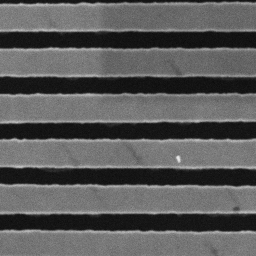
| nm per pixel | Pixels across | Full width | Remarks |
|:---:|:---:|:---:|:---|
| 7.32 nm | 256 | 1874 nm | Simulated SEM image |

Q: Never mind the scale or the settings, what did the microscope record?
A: lines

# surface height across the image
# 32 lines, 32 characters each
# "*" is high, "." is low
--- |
*.******************************
********************************
********************************
********************************
................................
................................
********************************
********************************
********************************
********************************
................................
................................
********************************
********************************
********************************
................................
................................
***********.***..**..******.*..*
********************************
********************************
********************************
................................
................................
********************************
********************************
********************************
********************************
................................
................................
********************************
********************************
********************************